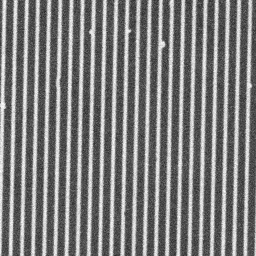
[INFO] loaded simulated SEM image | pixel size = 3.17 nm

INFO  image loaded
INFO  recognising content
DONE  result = parallel lines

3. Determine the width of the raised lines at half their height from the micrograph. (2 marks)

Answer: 11.5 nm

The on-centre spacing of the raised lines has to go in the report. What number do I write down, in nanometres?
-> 35.4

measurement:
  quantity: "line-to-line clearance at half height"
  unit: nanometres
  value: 25.8